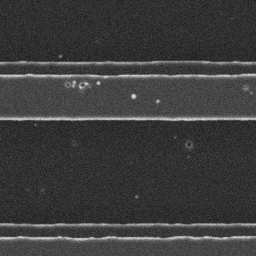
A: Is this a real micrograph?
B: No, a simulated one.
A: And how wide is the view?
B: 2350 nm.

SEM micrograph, lines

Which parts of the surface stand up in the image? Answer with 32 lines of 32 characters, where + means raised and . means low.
................................
................................
................................
................................
................................
................................
................................
................................
................................
+++++++++++++.++++++++++++++++++
++++++++++++++++++++++++++++++++
++++++++++++++++++++++++++++++++
++++++++++++++++++++++++++++++++
++++++++++++++++++++++++++++++++
++++++++++++++++++++++++++++++++
................................
................................
................................
................................
................................
................................
................................
................................
................................
................................
................................
................................
................................
................................
................................
++++++++++++++++++++++++++++++++
++++++++++++++++++++++++++++++++